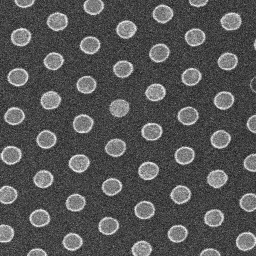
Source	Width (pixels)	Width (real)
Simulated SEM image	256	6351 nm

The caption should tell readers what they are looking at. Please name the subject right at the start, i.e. a regular array of raised bodies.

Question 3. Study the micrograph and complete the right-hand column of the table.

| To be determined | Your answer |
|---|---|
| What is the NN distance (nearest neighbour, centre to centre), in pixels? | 39.2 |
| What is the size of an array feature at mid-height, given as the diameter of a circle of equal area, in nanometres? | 435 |